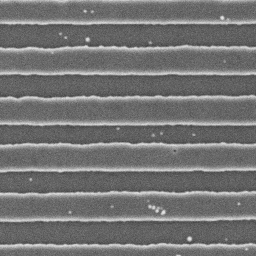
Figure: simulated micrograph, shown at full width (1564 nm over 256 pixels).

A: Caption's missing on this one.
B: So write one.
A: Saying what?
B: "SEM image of lines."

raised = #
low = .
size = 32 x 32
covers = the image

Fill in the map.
################################
################################
################################
................................
................................
................................
################################
################################
################################
................................
................................
................................
################################
################################
################################
...####.########################
................................
................................
################################
################################
################################
................................
................................
................................
################################
################################
################################
###########################.....
................................
................................
....................#..#...#...#
################################